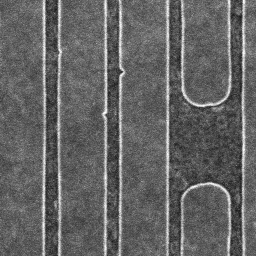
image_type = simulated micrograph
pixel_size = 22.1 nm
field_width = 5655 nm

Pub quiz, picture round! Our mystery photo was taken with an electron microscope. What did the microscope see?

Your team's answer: one or a few lines or trenches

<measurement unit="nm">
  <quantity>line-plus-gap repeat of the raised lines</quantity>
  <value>1370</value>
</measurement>